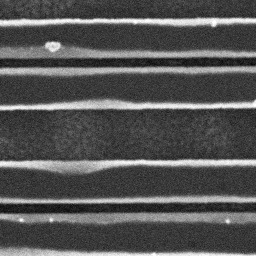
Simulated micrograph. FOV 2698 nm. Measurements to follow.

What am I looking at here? lines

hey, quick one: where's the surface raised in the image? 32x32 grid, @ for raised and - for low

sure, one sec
--------------------------------
--------------------------------
--------------------------------
@@@@@@@@@@@@@@@@@@@@@@@@@@@@@@@@
@@@@@@@@@@@@@@@@@@@@@@@@@@@@@@@@
@@@@@@@@@@@@@@@@@@@@@@@@@@@@@@@@
@@@@@@@@@@@@@@@@@@@@@@@@@@@@@@@@
--------------------------------
--------------------------------
@@@@@@@@@@@@@@@@@@@@@@@@@@@@@@@@
@@@@@@@@@@@@@@@@@@@@@@@@@@@@@@@@
@@@@@@@@@@@@@@@@@@@@@@@@@@@@@@@@
@@@@@@@@@@@@@@@@@@@@@@@@@@@@@@@@
@@------------------------------
--------------------------------
--------------------------------
--------------------------------
--------------------------------
--------------------------------
--------------------------------
@@@@@@------@@@@@@@@@@@@@@@@@@@@
@@@@@@@@@@@@@@@@@@@@@@@@@@@@@@@@
@@@@@@@@@@@@@@@@@@@@@@@@@@@@@@@@
@@@@@@@@@@@@@@@@@@@@@@@@@@@@@@@@
@@@@@@@@@@@@@@@@@@@@@@@@@@@@@@@@
--------------------------------
--------------------------------
@@@@@@@@@@@@@@@@@@@@@@@@@@@@@@@@
@@@@@@@@@@@@@@@@@@@@@@@@@@@@@@@@
@@@@@@@@@@@@@@@@@@@@@@@@@@@@@@@@
@@@@@@@@@@@@@@@@@@@@@@@@@@@@@@@@
@@@@@@@@@@@@@@@@@@@@@@@@@@@@@@@@